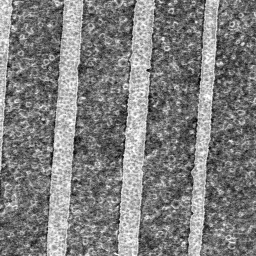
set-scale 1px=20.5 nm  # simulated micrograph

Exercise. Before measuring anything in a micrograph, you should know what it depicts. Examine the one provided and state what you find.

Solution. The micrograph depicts one or a few lines or trenches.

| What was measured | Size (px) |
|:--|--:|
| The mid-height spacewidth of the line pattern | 51.9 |